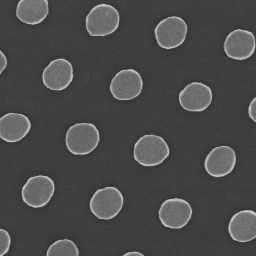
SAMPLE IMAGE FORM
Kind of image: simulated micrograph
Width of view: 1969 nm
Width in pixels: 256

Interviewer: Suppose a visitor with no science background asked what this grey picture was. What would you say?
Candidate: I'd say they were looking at a regular array of raised bodies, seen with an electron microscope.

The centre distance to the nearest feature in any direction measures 0.526 micrometres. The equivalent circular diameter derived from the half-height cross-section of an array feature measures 239 nanometers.